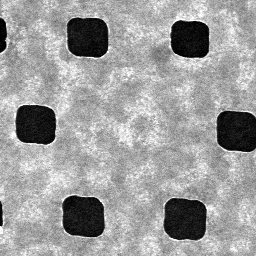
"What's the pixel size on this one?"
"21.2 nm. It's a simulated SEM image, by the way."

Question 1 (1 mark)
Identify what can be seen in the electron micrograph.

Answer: holes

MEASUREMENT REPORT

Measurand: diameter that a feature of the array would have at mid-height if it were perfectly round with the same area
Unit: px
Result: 43.4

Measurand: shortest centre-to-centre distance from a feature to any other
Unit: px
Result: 102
